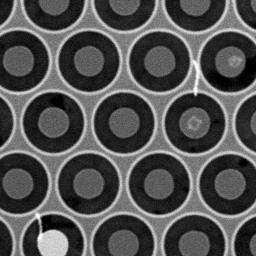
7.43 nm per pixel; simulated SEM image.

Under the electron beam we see an array of small figures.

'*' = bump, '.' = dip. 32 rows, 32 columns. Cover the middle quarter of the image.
...*******....**....********....
...******.....**.....******.....
.....***......**......****.....*
.............****..............*
............******............**
*..........********..........***
***.......**********........****
.***********.......***********..
..********..........********....
...******............******.....
....****..............****......
.....***.....****.....****.....*
.....**.....******.....**.....**
*....**....********....**....***
*....**....********....**....***
*....**....********....**....***
*....**.....******.....**....***
.....***.....*****.....**.....**
.....***..............****......
....*****.............****......
...******............******.....
.*********..........********....
***......****....****......***..
*..........********..........***
............******...........***
.............****.............**
.....***.....****..............*
...******.....**.....*****.....*
...*******....**.....******.....
...*******....**....*******.....
...*******....**....*******.....
...******.....**....*******.....